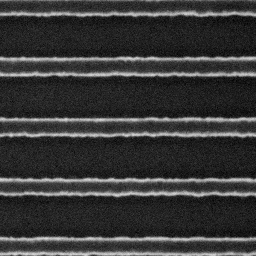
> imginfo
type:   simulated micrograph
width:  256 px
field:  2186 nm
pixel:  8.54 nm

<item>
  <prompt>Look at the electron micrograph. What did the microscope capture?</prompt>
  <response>lines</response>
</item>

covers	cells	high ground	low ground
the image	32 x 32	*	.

********************************
********************************
................................
................................
................................
................................
................................
********************************
********************************
................................
................................
................................
................................
................................
................................
********************************
********************************
................................
................................
................................
................................
................................
********************************
********************************
................................
................................
................................
................................
................................
................................
********************************
********************************